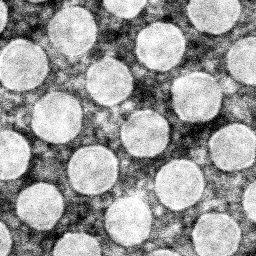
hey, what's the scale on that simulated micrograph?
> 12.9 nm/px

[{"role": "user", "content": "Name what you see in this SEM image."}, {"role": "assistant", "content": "a regular array of raised bodies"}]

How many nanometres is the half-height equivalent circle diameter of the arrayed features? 596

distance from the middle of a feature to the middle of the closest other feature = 803 nanometres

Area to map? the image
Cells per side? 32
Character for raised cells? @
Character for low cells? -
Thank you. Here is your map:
-------------@@@@@------@@@@@@--
@-------@@@---@@@-------@@@@@@--
@------@@@@@------------@@@@@---
------@@@@@@------@@@@---@@@@---
------@@@@@@-----@@@@@@---------
-@@@---@@@@------@@@@@@-------@@
@@@@@---@@-------@@@@@@------@@@
@@@@@@-------@----@@@@-------@@@
@@@@@@-----@@@@@---@@--------@@@
@@@@@@-----@@@@@--------@@---@@@
-@@@@------@@@@@------@@@@@-----
-----------@@@@@------@@@@@@----
-----@@@@---@@@-------@@@@@-----
----@@@@@@------------@@@@@-----
----@@@@@@-------@@@---@@@@-----
----@@@@@@------@@@@@-----------
@----@@@@@-----@@@@@@------@@@@-
@@@---@@-------@@@@@@------@@@@@
@@@--------@@---@@@@------@@@@@@
@@@@-----@@@@@-------------@@@@@
@@@------@@@@@-------@@@---@@@@-
@@@------@@@@@------@@@@@-------
---------@@@@@------@@@@@-------
----@@@---@@@-------@@@@@------@
---@@@@-------------@@@@@------@
--@@@@@@-------------@@@-------@
--@@@@@@-----------------------@
---@@@@------------------@@@@---
@----@------------------@@@@@@--
@-------@@@-------------@@@@@@--
@------@@@@@------------@@@@@@--
@------@@@@@-------@@----@@@@---